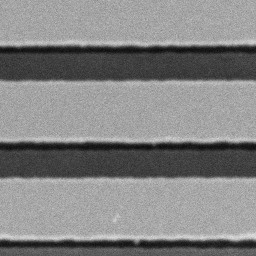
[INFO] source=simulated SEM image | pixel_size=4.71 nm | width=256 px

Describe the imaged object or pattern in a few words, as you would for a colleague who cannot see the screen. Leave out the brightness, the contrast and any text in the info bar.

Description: lines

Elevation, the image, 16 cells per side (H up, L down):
HHHHHHHHHHHHHHHH
HHHHHHHHHHHHHHHH
HHHHHHHHHHHHHHHH
LLLLLLLLLLLLLLLL
LLLLLLLLLLLLLLLL
HHHHHHHHHHHHHHHH
HHHHHHHHHHHHHHHH
HHHHHHHHHHHHHHHH
HHHHHHHHHHHHHHHH
LLLLLLLLLLLLLLLL
LLLLLLLLLLLLLLLL
HHHHHHHHHHHHHHHH
HHHHHHHHHHHHHHHH
HHHHHHHHHHHHHHHH
HHHHHHHHHHHHHHHH
LLLLLLLLLLLLLLLL